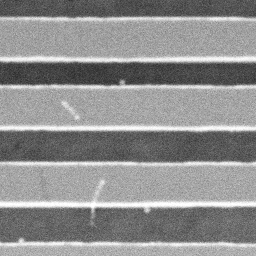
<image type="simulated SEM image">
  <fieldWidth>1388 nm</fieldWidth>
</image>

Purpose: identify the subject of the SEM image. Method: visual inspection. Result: lines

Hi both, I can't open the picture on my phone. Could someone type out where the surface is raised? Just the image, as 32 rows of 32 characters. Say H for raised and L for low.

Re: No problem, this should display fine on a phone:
LLLLLLLLLLLLLLLLLLLLLLLLLLLLLLLL
LLLLLLLLLLLLLLLLLLLLLLLLLLLLLLLL
HHHHHHHHHHHHHHHHHHHHHHHHHHHHHHHH
HHHHHHHHHHHHHHHHHHHHHHHHHHHHHHHH
HHHHHHHHHHHHHHHHHHHHHHHHHHHHHHHH
HHHHHHHHHHHHHHHHHHHHHHHHHHHHHHHH
HHHHHHHHHHHHHHHHHHHHHHHHHHHHHHHH
HHHHHHHHHHHHHHHHHHHHHHHHHHHHHHHH
LLLLLLLLLLLLLLLLLLLLLLLLLLLLLLLL
LLLLLLLLLLLLLLLLLLLLLLLLLLLLLLLL
LLLLLLLLLLLLLLLLLLLLLLLLLLLLLLLL
HHHHHHHHHHHHHHHHHHHHHHHHHHHHHHHH
HHHHHHHHHHHHHHHHHHHHHHHHHHHHHHHH
HHHHHHHHHHHHHHHHHHHHHHHHHHHHHHHH
HHHHHHHHHHHHHHHHHHHHHHHHHHHHHHHH
HHHHHHHHHHHHHHHHHHHHHHHHHHHHHHHH
LLLLLLLLLLLLLLLLLLLLLLLLLLLLLLLL
LLLLLLLLLLLLLLLLLLLLLLLLLLLLLLLL
LLLLLLLLLLLLLLLLLLLLLLLLLLLLLLLL
LLLLLLLLLLLLLLLLLLLLLLLLLLLLLLLL
HHHHHHHHHHHHHHHHHHHHHHHHHHHHHHHH
HHHHHHHHHHHHHHHHHHHHHHHHHHHHHHHH
HHHHHHHHHHHHHHHHHHHHHHHHHHHHHHHH
HHHHHHHHHHHHHHHHHHHHHHHHHHHHHHHH
HHHHHHHHHHHHHHHHHHHHHHHHHHHHHHHH
HHHHHHHHHHHHHHHHHHHHHHHHHHHHHHHH
LLLLLLLLLLLLLLLLLLLLLLLLLLLLLLLL
LLLLLLLLLLLLLLLLLLLLLLLLLLLLLLLL
LLLLLLLLLLLLLLLLLLLLLLLLLLLLLLLL
LLLLLLLLLLLLLLLLLLLLLLLLLLLLLLLL
HHHHHHHHHHHHHHHHHHHHHHHHHHHHHHLL
HHHHHHHHHHHHHHHHHHHHHHHHHHHHHHHH